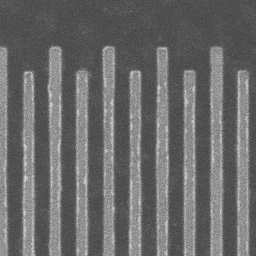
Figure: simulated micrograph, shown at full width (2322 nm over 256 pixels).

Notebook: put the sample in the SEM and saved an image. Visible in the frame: parallel lines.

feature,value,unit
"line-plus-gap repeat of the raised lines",243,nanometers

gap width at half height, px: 7.24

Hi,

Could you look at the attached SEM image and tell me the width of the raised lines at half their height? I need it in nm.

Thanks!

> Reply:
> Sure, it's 172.